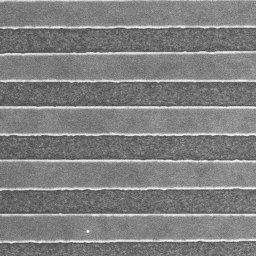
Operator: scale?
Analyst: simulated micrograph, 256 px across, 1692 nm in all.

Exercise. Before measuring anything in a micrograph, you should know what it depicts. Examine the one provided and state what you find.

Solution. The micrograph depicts lines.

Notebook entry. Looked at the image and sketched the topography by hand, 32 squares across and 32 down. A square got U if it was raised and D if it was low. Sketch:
UUUUUUUUUUUUUUUUUUUUUUUUUUUUUUUU
UUUUUUUUUUUUUUUUUUUUUUUUUUUUUUUU
UUUUUUUUUUUUUUUUUUUUUUUUUUUUUUUU
UUDDDDDDDDDDDDDDDDDDDDDDDDDDDDDD
DDDDDDDDDDDDDDDDDDDDDDDDDDDDDDDD
DDDDDDDDDDDDDDDDDDDDDDDDDDDDDDDD
DDDDDDDDDDDDDDDDDDDDDDDDDUDUUUUU
UUUUUUUUUUUUUUUUUUUUUUUUUUUUUUUU
UUUUUUUUUUUUUUUUUUUUUUUUUUUUUUUU
UUUUUUUUUUUUUUUUUUUUUUUUUUUUUUUU
DDDDDDDDDDDDDDDDDDDDDDDDDDDDDDDD
DDDDDDDDDDDDDDDDDDDDDDDDDDDDDDDD
DDDDDDDDDDDDDDDDDDDDDDDDDDDDDDDD
UUUUUUUUUUUUUUUUUUUUUUUUUUUUUUUU
UUUUUUUUUUUUUUUUUUUUUUUUUUUUUUUU
UUUUUUUUUUUUUUUUUUUUUUUUUUUUUUUU
UUUUUUUUUUUUUUUUUUUUUUUUUUUUUUUU
DDDDDDDDDDDDDDDDDDDDDDDDDDDDDDDD
DDDDDDDDDDDDDDDDDDDDDDDDDDDDDDDD
DDDDDDDDDDDDDDDDDDDDDDDDDDDDDDDD
UUUUUUUUUUUUUUUUUUUUUUUUUUUUUUUU
UUUUUUUUUUUUUUUUUUUUUUUUUUUUUUUU
UUUUUUUUUUUUUUUUUUUUUUUUUUUUUUUU
UUUUUUUUUUUUUUUUUUUUUUUUUUUUUDUU
DDDDDDDDDDDDDDDDDDDDDDDDDDDDDDDD
DDDDDDDDDDDDDDDDDDDDDDDDDDDDDDDD
DDDDDDDDDDDDDDDDDDDDDDDDDDDDDDDD
UUUUUUUUUUUUUUUUUUUUUUUUUUUUUUUU
UUUUUUUUUUUUUUUUUUUUUUUUUUUUUUUU
UUUUUUUUUUUUUUUUUUUUUUUUUUUUUUUU
DDDDDDDDDDDDDDDDDDDDDDDDDDDDDDDD
DDDDDDDDDDDDDDDDDDDDDDDDDDDDDDDD